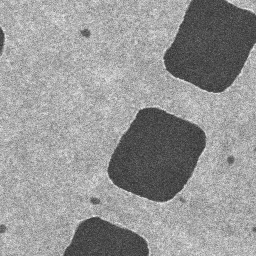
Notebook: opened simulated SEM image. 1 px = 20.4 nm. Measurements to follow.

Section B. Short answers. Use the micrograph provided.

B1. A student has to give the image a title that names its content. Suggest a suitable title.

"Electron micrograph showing holes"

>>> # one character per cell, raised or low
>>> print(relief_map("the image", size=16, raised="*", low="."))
************...*
***********.....
***********.....
**********......
***********....*
************..**
****************
********....****
********.....***
*******......***
*******.....****
*******.....****
*********..*****
****************
*****...********
****.....*******